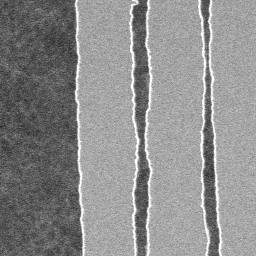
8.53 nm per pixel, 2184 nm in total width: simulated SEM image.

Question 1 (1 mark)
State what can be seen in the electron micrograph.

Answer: one or a few lines or trenches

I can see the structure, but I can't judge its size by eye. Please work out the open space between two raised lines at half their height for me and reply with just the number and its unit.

467 nanometers